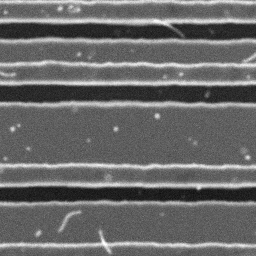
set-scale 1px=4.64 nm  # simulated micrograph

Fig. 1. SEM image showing lines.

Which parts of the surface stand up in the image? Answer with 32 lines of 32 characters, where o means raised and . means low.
oooooooooooooooooooooooooooooooo
oooooooooooooooooooooooooooooooo
oooooooooooooooooooooooooooooooo
................................
................................
oooooooooooooooooooooooooooooooo
oooooooooooooooooooooooooooooooo
oooooooooooooooooooooooooooooooo
oooooooooooooooooooooooooooooooo
oooooooooooooooooooooooooooooooo
oooo...ooooooooooooooooooooooooo
................................
................................
oooooooooooooooooooooooooooooooo
oooooooooooooooooooooooooooooooo
oooooooooooooooooooooooooooooooo
oooooooooooooooooooooooooooooooo
oooooooooooooooooooooooooooooooo
oooooooooooooooooooooooooooooooo
oooooooooooooooooooooooooooooooo
oooooooooooooooooooooooooooooooo
oooooooooooooooooooooooooooooooo
oooooooooooooooooooooooooooooooo
................................
................................
oooooooooooooooooooooooooooooooo
oooooooooooooooooooooooooooooooo
oooooooooooooooooooooooooooooooo
oooooooooooooooooooooooooooooooo
oooooooooooooooooooooooooooooooo
oooooooooooooooooooooooooooooooo
oooooooooooooooooooooooooooooooo